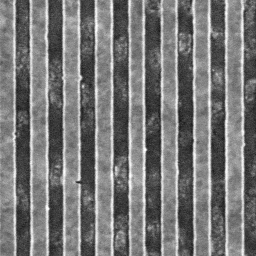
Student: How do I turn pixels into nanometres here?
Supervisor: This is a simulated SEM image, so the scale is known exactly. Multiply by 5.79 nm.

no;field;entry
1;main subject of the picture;parallel lines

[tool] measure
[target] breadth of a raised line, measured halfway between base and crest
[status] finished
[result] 90.5 nm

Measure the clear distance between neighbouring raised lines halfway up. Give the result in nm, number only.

101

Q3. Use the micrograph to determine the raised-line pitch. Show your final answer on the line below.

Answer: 0.189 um